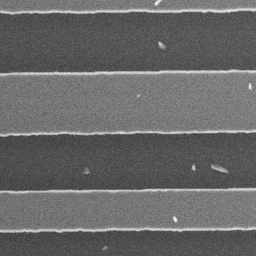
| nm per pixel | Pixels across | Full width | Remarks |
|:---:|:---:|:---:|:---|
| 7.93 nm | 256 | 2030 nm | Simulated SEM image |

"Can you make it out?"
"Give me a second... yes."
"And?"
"lines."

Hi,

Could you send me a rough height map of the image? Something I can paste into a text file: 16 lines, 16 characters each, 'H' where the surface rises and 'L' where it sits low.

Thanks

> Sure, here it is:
HHHHHHHHHHHHHHHH
LLLLLLLLLLLLLLLL
LLLLLLLLLLLLLLLL
LLLLLLLLLLLLLLLL
LLLLLLLHHHHHHHHH
HHHHHHHHHHHHHHHH
HHHHHHHHHHHHHHHH
HHHHHHHHHHHHHHHH
LLLLLLLLLLLLLLLL
LLLLLLLLLLLLLLLL
LLLLLLLLLLLLLLLL
LLLLLLLLLLLLLLLL
HHHHHHHHHHHHHHHH
HHHHHHHHHHHHHHHH
LLLLLLLLLLLLLLLL
LLLLLLLLLLLLLLLL